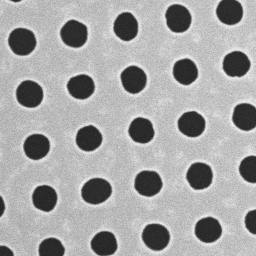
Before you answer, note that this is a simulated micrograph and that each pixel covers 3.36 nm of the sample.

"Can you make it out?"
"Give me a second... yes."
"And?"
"a regular array of holes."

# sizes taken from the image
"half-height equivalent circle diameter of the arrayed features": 89.7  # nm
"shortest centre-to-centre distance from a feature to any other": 0.175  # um